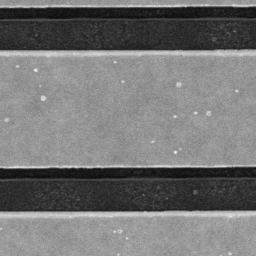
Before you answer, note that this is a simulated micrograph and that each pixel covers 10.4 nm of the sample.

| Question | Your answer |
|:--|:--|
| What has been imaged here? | lines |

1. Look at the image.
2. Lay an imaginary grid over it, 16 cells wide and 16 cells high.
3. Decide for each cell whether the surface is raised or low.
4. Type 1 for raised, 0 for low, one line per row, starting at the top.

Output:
0000000000000000
0000000000000000
0000000000000000
1111111111111111
1111111111111111
1111111111111111
1111111111111111
1111111111111111
1111111111111111
1111111111111111
0000000000000000
0000000000000000
0000000000000000
1111111111111111
1111111111111111
1111111111111111